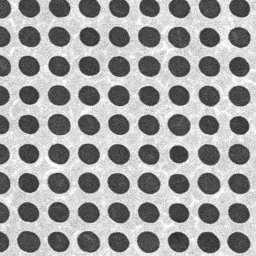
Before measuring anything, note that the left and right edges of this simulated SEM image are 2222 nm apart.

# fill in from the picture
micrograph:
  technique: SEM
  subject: a regular array of holes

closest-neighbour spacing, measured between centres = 29.1 pixels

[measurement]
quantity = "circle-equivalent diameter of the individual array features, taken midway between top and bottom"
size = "184 nm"